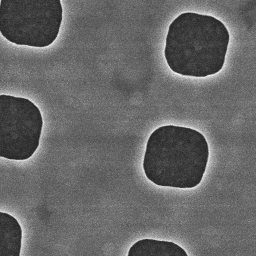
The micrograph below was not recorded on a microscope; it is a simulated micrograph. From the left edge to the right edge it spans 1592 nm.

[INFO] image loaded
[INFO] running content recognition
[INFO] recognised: holes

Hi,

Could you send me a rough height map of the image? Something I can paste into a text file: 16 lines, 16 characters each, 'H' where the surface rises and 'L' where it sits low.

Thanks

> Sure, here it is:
LLLLHHHHHHHHHHHH
LLLLHHHHHHHLLLHH
HLLHHHHHHHLLLLHH
HHHHHHHHHHLLLLHH
HHHHHHHHHHHLLHHH
HHHHHHHHHHHHHHHH
LLHHHHHHHHHHHHHH
LLLHHHHHHHHHHHHH
LLLHHHHHHLLLLHHH
LLHHHHHHHLLLLHHH
HHHHHHHHHLLLLHHH
HHHHHHHHHHLLHHHH
HHHHHHHHHHHHHHHH
LHHHHHHHHHHHHHHH
LHHHHHHHHHHHHHHH
LHHHHHHHLLLHHHHH